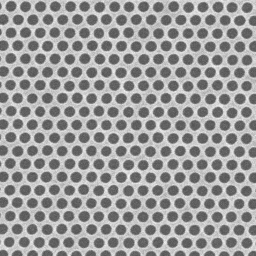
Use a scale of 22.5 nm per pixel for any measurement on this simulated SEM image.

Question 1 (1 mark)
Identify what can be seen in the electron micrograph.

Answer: a regular array of holes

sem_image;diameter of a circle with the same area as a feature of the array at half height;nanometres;256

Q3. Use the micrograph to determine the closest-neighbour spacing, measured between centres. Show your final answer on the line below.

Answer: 324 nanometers